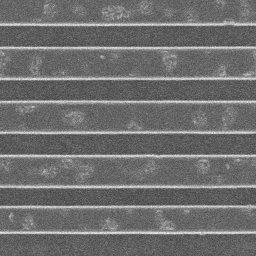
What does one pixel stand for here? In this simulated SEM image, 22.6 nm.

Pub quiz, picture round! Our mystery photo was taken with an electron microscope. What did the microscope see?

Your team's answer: parallel lines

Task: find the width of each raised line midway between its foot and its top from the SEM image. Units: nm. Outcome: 699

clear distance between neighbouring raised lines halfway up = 506 nanometers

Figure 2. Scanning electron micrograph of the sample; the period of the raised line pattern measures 1180 nm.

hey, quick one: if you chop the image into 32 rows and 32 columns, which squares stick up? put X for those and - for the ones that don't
XXXXXXXXXXXXXXXXXXXXXXXXXXXXXXXX
XXXXXXXXXXXXXXXXXXXXXXXXXXXXXXXX
XXXXXXXXXXXXXXXXXXXXXXXXXXXXXXXX
--------------------------------
--------------------------------
--------------------------------
XXXXXXXXXXXXXXXXXXXXXXXXXXXXXXXX
XXXXXXXXXXXXXXXXXXXXXXXXXXXXXXXX
XXXXXXXXXXXXXXXXXXXXXXXXXXXXXXXX
XXXXXXXXXXXXXXXXXXXXXXXXXXXXXXXX
--------------------------------
--------------------------------
--------------------------------
XXXXXXXXXXXXXXXXXXXXXXXXXXXXXXXX
XXXXXXXXXXXXXXXXXXXXXXXXXXXXXXXX
XXXXXXXXXXXXXXXXXXXXXXXXXXXXXXXX
X--XXXXXXXXXXXX--------XXXXXXXXX
--------------------------------
--------------------------------
--XXX-------------XX-------X----
XXXXXXXXXXXXXXXXXXXXXXXXXXXXXXXX
XXXXXXXXXXXXXXXXXXXXXXXXXXXXXXXX
XXXXXXXXXXXXXXXXXXXXXXXXXXXXXXXX
--------------------------------
--------------------------------
--------------------------------
XXXXXXXXXXXXXXXXXXXXXXXXXXXXXXXX
XXXXXXXXXXXXXXXXXXXXXXXXXXXXXXXX
XXXXXXXXXXXXXXXXXXXXXXXXXXXXXXXX
--------------------------------
--------------------------------
--------------------------------